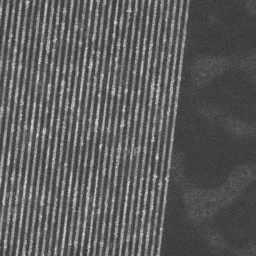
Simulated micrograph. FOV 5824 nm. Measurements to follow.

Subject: parallel lines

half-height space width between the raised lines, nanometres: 96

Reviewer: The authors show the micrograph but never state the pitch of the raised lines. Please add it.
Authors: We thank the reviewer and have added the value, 145 nm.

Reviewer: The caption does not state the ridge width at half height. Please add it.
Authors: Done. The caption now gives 48 nanometers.